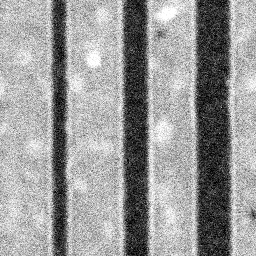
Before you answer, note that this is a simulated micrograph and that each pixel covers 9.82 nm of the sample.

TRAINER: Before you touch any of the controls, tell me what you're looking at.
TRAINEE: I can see one or a few lines or trenches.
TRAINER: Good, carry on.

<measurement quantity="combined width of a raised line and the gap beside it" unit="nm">753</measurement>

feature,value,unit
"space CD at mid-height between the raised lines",412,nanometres